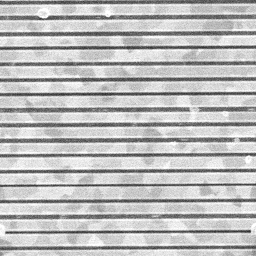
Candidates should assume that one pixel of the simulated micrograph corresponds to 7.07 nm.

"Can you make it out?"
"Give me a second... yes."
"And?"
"parallel lines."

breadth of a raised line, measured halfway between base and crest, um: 0.0734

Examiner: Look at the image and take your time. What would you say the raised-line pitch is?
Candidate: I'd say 15.3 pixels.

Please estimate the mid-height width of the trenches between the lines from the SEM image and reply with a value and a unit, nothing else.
36.2 nm